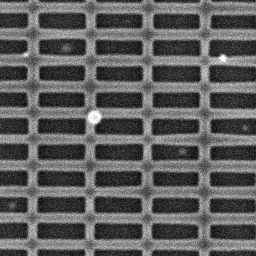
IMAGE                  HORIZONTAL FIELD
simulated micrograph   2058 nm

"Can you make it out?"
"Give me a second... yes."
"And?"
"groups of lines, slits or small figures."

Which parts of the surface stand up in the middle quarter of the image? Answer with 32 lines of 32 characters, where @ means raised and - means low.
-----@@@-----------@@@----------
------@@------------@@----------
-----@@@------------@@----------
-----@@@------------@@----------
-----@@@@----------@@@----------
@@@@@@@@@@@@@@@@@@@@@@@@@@@@@@@@
@@@@@@@@@@@@@@@@@@@@@@@@@@@@@@@@
-----@@@------------@@----------
-----@@@------------@@----------
-----@@@------------@@----------
-----@@@------------@@----------
@@@@@@@@@@@@@@@@@@@@@@@@@@@@@@@@
@@@@@@@@@@@@@@@@@@@@@@@@@@@@@@@@
-----@@@@----------@@@@-@@@@@@@@
------@@------------@@----------
------@@------------@@----------
------@@------------@@----------
-----@@@------------@@----------
@@@@@@@@@@@@@@@@@@@@@@@@@@@@@@@@
@@@@@@@@@@@@@@@@@@@@@@@@@@@@@@@@
-----@@@------------@@----------
------@@------------@@----------
-----@@@------------@@----------
-----@@@------------@@----------
@@@@@@@@@@@@@@@@@@@@@@@@@@@@@@@@
@@@@@@@@@@@@@@@@@@@@@@@@@@@@@@@@
@@@@@@@@@@@@@@@@@@@@@@@@@@@@@@@@
-----@@@------------@@----------
-----@@@------------@@----------
-----@@@------------@@----------
-----@@@-----------@@@----------
@@@@@@@@@@@@@@@@@@@@@@@@@@@@@@@@